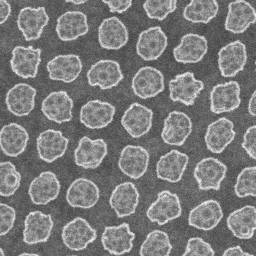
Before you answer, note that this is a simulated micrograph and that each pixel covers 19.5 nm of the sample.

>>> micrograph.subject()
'a regular array of raised bodies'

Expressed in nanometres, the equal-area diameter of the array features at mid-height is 570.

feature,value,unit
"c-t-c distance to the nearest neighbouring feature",756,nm